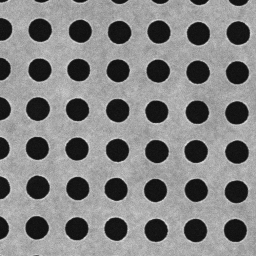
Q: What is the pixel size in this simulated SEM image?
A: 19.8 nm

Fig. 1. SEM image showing a regular array of holes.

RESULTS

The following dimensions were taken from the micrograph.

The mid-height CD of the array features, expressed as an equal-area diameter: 464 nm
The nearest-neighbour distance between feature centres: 0.775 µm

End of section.